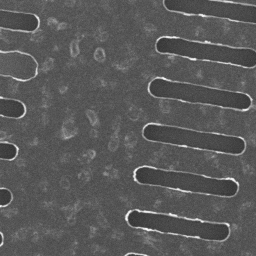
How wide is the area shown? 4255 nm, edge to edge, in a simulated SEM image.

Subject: holes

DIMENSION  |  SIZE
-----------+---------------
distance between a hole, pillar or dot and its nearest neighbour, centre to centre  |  732 nanometres